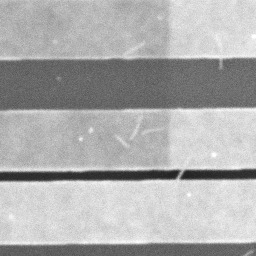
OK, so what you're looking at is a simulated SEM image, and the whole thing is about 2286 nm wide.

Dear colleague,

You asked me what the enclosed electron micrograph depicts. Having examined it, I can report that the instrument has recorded lines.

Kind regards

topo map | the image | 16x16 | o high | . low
oooooooooooooooo
oooooooooooooooo
oooooooooooooooo
oooooooooooooooo
................
................
................
oooooooooooooooo
oooooooooooooooo
oooooooooooooooo
oooooooooooooooo
oooooooooooooooo
oooooooooooooooo
oooooooooooooooo
oooooooooooooooo
................